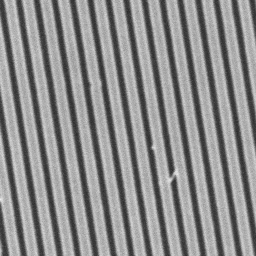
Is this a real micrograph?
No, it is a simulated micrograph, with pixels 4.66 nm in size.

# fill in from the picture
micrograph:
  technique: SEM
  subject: parallel lines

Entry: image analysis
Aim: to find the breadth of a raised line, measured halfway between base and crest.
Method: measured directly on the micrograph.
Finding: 0.0467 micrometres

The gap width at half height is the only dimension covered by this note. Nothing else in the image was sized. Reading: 37.9 nanometres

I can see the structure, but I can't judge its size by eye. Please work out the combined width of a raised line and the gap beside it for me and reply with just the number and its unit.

17.7 pixels